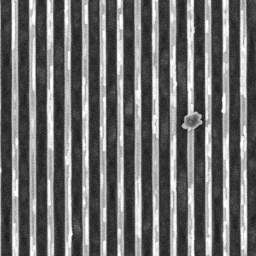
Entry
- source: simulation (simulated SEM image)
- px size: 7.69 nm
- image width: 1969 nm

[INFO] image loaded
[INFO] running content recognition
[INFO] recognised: parallel lines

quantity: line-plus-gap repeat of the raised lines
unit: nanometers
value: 135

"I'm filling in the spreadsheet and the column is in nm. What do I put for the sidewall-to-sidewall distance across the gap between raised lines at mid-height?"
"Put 91.3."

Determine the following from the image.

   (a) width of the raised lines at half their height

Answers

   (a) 39.4 nanometres